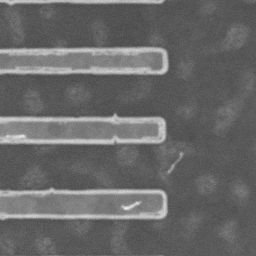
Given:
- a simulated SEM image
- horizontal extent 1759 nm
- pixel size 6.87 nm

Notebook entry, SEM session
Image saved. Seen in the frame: one or a few lines or trenches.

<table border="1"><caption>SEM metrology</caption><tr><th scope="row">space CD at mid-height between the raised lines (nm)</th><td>336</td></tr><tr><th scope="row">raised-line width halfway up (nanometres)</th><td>152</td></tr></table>